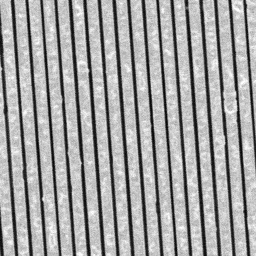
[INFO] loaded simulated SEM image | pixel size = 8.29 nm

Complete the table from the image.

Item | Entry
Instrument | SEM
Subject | parallel lines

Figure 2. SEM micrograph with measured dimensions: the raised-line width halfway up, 88.9 nanometres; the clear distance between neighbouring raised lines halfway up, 0.032 um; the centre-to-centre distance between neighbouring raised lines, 14.5 pixels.